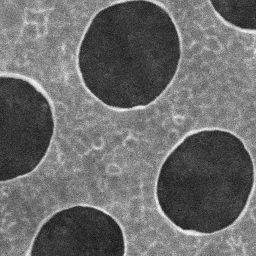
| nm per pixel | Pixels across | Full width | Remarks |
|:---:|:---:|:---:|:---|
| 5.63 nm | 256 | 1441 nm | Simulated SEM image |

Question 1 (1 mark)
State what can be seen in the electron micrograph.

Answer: holes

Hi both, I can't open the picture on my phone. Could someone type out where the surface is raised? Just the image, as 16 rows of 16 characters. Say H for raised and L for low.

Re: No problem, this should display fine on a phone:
HHHHHHHLLLHHHLLL
HHHHHHLLLLLHHHLL
HHHHHLLLLLLHHHHH
HHHHHLLLLLLHHHHH
HHHHHLLLLLLHHHHH
LLHHHHLLLLHHHHHH
LLLHHHHLLHHHHHHH
LLLHHHHHHHHHHHHH
LLLHHHHHHHHHLLLH
LLLHHHHHHHHLLLLH
LLHHHHHHHHLLLLLL
HHHHHHHHHHLLLLLL
HHHHHHHHHHLLLLLH
HHHLLLLHHHLLLLLH
HHLLLLLLHHHHLHHH
HHLLLLLLHHHHHHHH